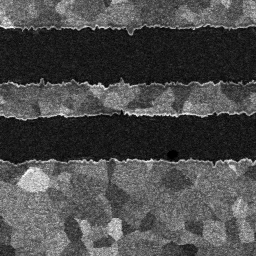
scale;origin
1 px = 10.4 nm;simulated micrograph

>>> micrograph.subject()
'one or a few lines or trenches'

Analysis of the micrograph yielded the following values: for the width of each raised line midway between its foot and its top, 328 nm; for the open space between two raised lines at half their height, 526 nanometers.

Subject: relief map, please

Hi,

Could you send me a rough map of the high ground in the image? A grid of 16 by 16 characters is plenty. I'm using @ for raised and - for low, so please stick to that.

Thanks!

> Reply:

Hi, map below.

@@@@@@@@@@@@@@@@
@@@@@@@@@@@@@@@@
----------------
----------------
----------------
@@@@@@@@@@@@@@@@
@@@@@@@@@@@@@@@@
----------------
----------------
----------------
@@@@@@@@@@@@@@@@
@@@@@@@@@@@@@@@@
@@@@@@@@@@@@@@@@
@@@@@@@@@@@@@@@@
@@@@@@@@@@@@@@@@
@@@@@@@@@@@@@@@@